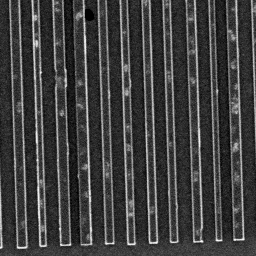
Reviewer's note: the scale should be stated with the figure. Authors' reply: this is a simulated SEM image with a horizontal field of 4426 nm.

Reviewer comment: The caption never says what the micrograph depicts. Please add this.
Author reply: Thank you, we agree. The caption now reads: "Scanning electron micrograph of parallel lines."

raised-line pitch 375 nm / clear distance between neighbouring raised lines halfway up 246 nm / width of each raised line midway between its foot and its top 0.138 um